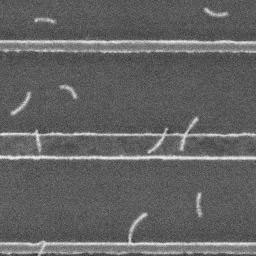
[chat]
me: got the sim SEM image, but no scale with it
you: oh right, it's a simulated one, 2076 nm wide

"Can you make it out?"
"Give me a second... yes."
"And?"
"lines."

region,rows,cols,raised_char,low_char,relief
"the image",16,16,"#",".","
................
................
................
................
................
................
................
................
################
################
................
................
................
................
................
################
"